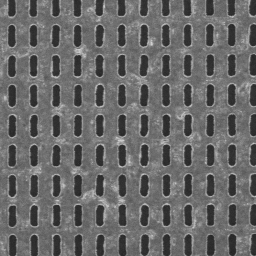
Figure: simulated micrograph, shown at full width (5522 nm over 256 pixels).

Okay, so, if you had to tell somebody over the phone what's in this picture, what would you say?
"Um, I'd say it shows a regular array of holes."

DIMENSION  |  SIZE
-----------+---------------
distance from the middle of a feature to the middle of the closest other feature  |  468 nanometers